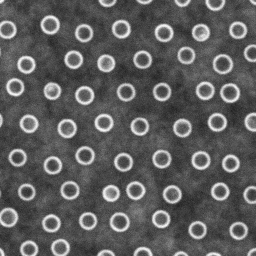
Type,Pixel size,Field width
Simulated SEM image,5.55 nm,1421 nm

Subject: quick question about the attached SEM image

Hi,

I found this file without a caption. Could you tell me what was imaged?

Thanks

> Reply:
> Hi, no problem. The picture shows a regular array of raised bodies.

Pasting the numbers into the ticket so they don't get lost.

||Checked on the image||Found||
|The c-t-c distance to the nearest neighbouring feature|176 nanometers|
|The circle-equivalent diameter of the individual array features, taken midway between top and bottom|0.0902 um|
